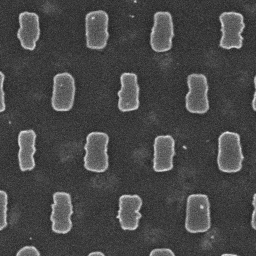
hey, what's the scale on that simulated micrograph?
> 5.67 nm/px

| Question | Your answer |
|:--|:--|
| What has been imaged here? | a regular array of raised bodies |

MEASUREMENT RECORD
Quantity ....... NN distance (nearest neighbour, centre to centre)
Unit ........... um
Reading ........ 0.379